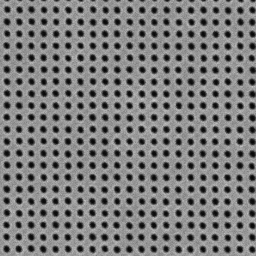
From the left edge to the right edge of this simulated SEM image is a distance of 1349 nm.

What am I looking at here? a regular array of holes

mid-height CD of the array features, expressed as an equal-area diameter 34.6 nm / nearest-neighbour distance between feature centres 61.3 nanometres